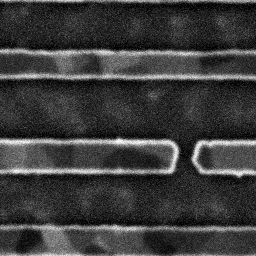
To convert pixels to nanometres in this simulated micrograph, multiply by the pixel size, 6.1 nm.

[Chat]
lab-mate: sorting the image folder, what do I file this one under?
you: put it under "one or a few lines or trenches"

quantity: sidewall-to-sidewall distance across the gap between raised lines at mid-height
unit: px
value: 55.9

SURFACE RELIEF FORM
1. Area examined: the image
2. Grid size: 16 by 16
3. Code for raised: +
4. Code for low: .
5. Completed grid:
................
................
................
++++++++++++++++
++++++++++++++++
................
................
................
................
+++++++++++.++++
+++++++++++.++++
................
................
................
++++++++++++++++
++++++++++++++++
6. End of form